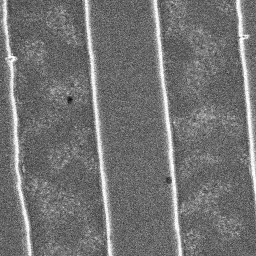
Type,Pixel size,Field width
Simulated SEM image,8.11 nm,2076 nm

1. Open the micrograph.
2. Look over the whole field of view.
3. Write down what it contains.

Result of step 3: one or a few lines or trenches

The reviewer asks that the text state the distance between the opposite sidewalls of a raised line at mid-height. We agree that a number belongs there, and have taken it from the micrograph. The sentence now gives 568 nanometres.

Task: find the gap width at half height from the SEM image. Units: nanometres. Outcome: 660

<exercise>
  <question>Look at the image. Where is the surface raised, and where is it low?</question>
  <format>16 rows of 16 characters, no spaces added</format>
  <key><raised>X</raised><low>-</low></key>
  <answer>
-----XXXXX-----X
-----XXXXX-----X
------XXXX-----X
X-----XXXX-----X
X-----XXXX-----X
X-----XXXX-----X
X-----XXXX-----X
X-----XXXX------
X-----XXXXX-----
X-----XXXXX-----
X-----XXXXX-----
X-----XXXXX-----
X------XXXX-----
XX-----XXXX-----
XX-----XXXX-----
XX-----XXXX-----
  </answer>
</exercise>